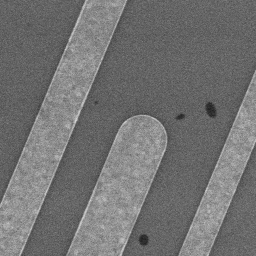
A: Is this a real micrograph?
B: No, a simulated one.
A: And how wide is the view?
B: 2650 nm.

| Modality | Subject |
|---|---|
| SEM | groups of lines, slits or small figures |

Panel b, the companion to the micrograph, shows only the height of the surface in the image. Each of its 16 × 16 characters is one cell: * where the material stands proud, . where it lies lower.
.....***........
.....**.........
....***.........
....**..........
...***..........
...***..........
...**..........*
..***...**.....*
..**...***....**
.***...***....**
.***..****...**.
.**...***....**.
***...***....*..
**...****...**..
**...***....**..
*...****...**...